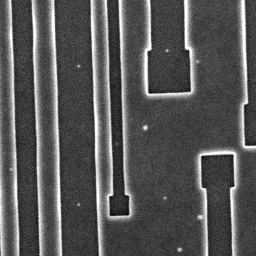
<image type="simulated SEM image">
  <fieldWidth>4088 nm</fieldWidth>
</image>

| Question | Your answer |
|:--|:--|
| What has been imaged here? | groups of lines, slits or small figures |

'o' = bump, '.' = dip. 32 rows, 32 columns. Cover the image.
o...ooo....oo..oooo....ooooooo..
o...ooo.....o..oooo....ooooooo..
o...ooo.....o..oooo....ooooooo..
o...ooo.....o..oooo....oooooooo.
o...ooo.....o..oooo....oooooooo.
o...ooo.....o..oooo....oooooooo.
oo..ooo.....oo.ooo......ooooooo.
oo..ooo.....oo.ooo......ooooooo.
oo..ooo.....oo.ooo......ooooooo.
oo..ooo.....oo.ooo......ooooooo.
oo..ooo.....oo.ooo......ooooooo.
oo..ooo.....oo.oooo.....ooooooo.
oo..ooo.....oo.oooooooooooooooo.
oo..ooo.....oo.ooooooooooooooo..
oo...oo.....oo.ooooooooooooooo..
oo...oo.....oo.ooooooooooooooo..
oo...oo.....oo.ooooooooooooooo..
oo...oo.....oo..oooooooooooooo..
oo...oo.....oo..oooooooooooooooo
oo...oo.....oo..ooooooooo....ooo
oo...oo.....oo..ooooooooo....ooo
oo...oo.....oo..ooooooooo....ooo
oo...oo.....oo..ooooooooo....ooo
oo...oo.....oo..ooooooooo....ooo
oo...oo.....oo..oooooooooo...ooo
oo...oo.....oo..oooooooooo...ooo
oo...oo.....oo..oooooooooo...ooo
oo...ooo....oooooooooooooo...ooo
oo...ooo....oooooooooooooo...ooo
oo...ooo....oooooooooooooo...ooo
oo...ooo....oooooooooooooo...ooo
oo...ooo....oooooooooooooo...ooo